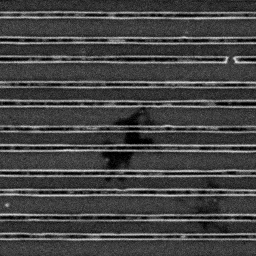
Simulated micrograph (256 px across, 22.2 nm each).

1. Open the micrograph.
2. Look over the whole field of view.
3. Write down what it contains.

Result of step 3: parallel lines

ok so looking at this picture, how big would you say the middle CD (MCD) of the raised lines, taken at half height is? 131 nm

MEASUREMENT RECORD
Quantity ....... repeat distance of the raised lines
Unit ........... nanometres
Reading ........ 493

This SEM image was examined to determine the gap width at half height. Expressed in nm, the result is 371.